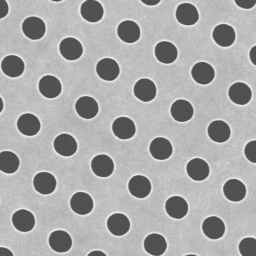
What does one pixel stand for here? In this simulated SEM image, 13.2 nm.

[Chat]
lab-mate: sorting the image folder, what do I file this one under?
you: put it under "a regular array of holes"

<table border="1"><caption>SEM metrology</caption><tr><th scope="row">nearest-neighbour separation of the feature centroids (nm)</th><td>560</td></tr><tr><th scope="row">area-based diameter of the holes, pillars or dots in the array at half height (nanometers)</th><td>304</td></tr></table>